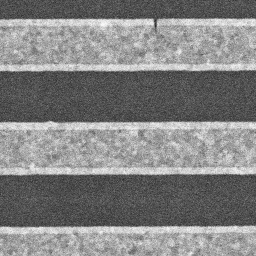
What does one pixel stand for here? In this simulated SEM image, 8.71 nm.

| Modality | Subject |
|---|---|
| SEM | one or a few lines or trenches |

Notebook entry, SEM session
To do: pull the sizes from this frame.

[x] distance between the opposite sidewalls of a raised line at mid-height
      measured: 394 nanometers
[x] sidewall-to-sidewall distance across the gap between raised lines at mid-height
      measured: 512 nanometres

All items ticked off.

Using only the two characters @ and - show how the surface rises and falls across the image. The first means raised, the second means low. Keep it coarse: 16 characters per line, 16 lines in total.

----------------
@@@@@@@@@@@@@@@@
@@@@@@@@@@@@@@@@
@@@@@@@@@@@@@@@@
----------------
----------------
----------------
----------------
@@@@@@@@@@@@@@@@
@@@@@@@@@@@@@@@@
@@@@@@@@@@@@@@@@
----------------
----------------
----------------
@@@@@@@@@@@@@@@@
@@@@@@@@@@@@@@@@